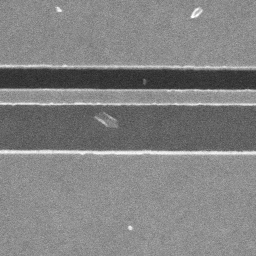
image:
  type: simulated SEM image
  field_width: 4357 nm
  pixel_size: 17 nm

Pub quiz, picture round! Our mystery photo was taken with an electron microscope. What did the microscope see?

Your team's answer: lines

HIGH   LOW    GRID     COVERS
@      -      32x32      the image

@@@@@@@@@@@@@@@@@@@@@@@@@@@@@@@@
@@@@@@@@@@@@@@@@@@@@@@@@@@@@@@@@
@@@@@@@@@@@@@@@@@@@@@@@@@@@@@@@@
@@@@@@@@@@@@@@@@@@@@@@@@@@@@@@@@
@@@@@@@@@@@@@@@@@@@@@@@@@@@@@@@@
@@@@@@@@@@@@@@@@@@@@@@@@@@@@@@@@
@@@@@@@@@@@@@@@@@@@@@@@@@@@@@@@@
@@@@@@@@@@@@@@@@@@@@@@@@@@@@@@@@
--------------------------@@-@@@
--------------------------------
--------------------------------
@@@@@@@@@@@@@@@@@@@@@@@@@@@@@@@@
@@@@@@@@@@@@@@@@@@@@@@@@@@@@@@@@
--------------------------------
--------------------------------
--------------------------------
--------------------------------
--------------------------------
--------------------------------
@@@@@@@@@@@@@@@@@@@@@@@@@@@@@@@@
@@@@@@@@@@@@@@@@@@@@@@@@@@@@@@@@
@@@@@@@@@@@@@@@@@@@@@@@@@@@@@@@@
@@@@@@@@@@@@@@@@@@@@@@@@@@@@@@@@
@@@@@@@@@@@@@@@@@@@@@@@@@@@@@@@@
@@@@@@@@@@@@@@@@@@@@@@@@@@@@@@@@
@@@@@@@@@@@@@@@@@@@@@@@@@@@@@@@@
@@@@@@@@@@@@@@@@@@@@@@@@@@@@@@@@
@@@@@@@@@@@@@@@@@@@@@@@@@@@@@@@@
@@@@@@@@@@@@@@@@@@@@@@@@@@@@@@@@
@@@@@@@@@@@@@@@@@@@@@@@@@@@@@@@@
@@@@@@@@@@@@@@@@@@@@@@@@@@@@@@@@
@@@@@@@@@@@@@@@@@@@@@@@@@@@@@@@@